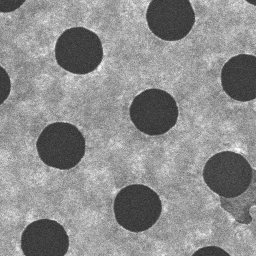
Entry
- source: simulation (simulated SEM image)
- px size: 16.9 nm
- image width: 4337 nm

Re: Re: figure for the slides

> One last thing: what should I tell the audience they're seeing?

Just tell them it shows holes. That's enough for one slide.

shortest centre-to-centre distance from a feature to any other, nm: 1640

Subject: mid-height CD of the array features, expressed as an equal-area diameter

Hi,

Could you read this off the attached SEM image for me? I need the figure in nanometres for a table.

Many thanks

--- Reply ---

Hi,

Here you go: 816